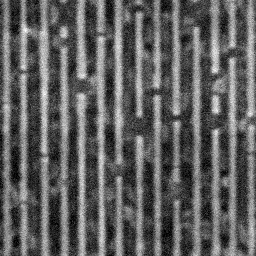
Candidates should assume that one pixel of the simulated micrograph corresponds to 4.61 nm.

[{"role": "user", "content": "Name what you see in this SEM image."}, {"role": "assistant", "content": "parallel lines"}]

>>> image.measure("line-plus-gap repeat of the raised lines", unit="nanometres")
86.6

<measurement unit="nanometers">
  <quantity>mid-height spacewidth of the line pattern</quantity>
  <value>62.7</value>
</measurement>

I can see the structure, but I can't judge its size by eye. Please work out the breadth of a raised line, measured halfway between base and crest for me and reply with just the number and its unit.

24.8 nanometres